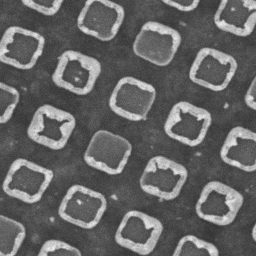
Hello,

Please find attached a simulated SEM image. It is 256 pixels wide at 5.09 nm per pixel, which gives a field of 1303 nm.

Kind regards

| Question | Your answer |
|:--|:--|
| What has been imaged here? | a regular array of raised bodies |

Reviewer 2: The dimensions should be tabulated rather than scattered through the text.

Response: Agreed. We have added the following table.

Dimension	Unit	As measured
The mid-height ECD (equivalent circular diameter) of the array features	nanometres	217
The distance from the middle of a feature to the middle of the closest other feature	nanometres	304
